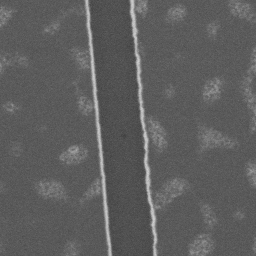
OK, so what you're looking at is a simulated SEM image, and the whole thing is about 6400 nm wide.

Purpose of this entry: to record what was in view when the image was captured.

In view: one or a few lines or trenches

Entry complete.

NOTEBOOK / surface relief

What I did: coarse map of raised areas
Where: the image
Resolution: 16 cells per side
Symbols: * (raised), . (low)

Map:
*****...********
******..********
******..********
******...*******
******...*******
******...*******
******...*******
******...*******
******...*******
******...*******
******...*******
******...*******
*******..*******
*******...******
*******...******
*******...******